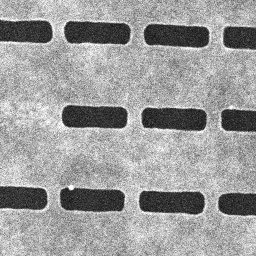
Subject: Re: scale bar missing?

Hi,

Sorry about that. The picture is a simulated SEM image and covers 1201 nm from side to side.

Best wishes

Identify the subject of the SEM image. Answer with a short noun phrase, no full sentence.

holes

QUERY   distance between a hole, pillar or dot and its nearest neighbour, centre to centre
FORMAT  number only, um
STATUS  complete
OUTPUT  0.374